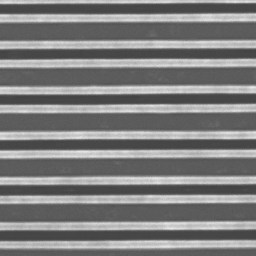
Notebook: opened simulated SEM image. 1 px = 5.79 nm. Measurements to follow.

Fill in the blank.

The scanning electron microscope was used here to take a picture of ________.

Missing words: parallel lines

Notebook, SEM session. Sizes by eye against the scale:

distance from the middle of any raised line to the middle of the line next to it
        0.131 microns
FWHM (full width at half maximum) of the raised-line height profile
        51.3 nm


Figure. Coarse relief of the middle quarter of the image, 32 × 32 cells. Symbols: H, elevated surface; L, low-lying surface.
HHHHHHHHHHHHHHHHHHHHHHHHHHHHHHHH
LLLLLLLLLLLLLLLLLLLLLLLLLLLLLLLL
LLLLLLLLLLLLLLLLLLLLLLLLLLLLLLLL
LLLLLLLLLLLLLLLLLLLLLLLLLLLLLLLL
LLLLLLLLLLLLLLLLLLLLLLLLLLLLLLLL
LLLLLLLLLLLLLLLLHHHHHHHHHHHHHHHH
HHHHHHHHHHHHHHHHHHHHHHHHHHHHHHHH
HHHHHHHHHHHHHHHHHHHHLLLLLLLLLLLL
LLLLLLLLLLLLLLLLLLLLLLLLLLLLLLLL
LLLLLLLLLLLLLLLLLLLLLLLLLLLLLLLL
HHHHHHHHHHHHHHHHHHHHHHHHHHHHHHHH
HHHHHHHHHHHHHHHHHHHHHHHHHHHHHHHH
LLLLLLLLLLLLLLLLLLLLLLLLLLLLLLLL
LLLLLLLLLLLLLLLLLLLLLLLLLLLLLLLL
LLLLLLLLLLLLLLLLLLLLLLLLLLLLLLLL
LLLLLLLLLLLLLLLLLLLLLLLLLLLLLLLL
LLLLLLLLLLLLLLLLLLLLLLLLLLLLLLLL
HHHHHHHHHHHHHHHHHHHHHHHHHHHHHHHH
HHHHHHHHHHHHHHHHHHHHHHHHHHHHHHHH
LLLLLLLLLLLLLLLLLLLLLLLLLLLLLLLL
LLLLLLLLLLLLLLLLLLLLLLLLLLLLLLLL
LLLLLLLLLLLLLLLLHHHHHHHHHHHHHHHH
HHHHHHHHHHHHHHHHHHHHHHHHHHHHHHHH
HHHHHHHHHLLLLLLLLLLLLLLLLLLLLLLL
LLLLLLLLLLLLLLLLLLLLLLLLLLLLLLLL
LLLLLLLLLLLLLLLLLLLLLLLLLLLLLLLL
LLLLLLLLLLLLLLLLLLLLLLLLLLLLLLLL
LLLLLLLLLLLLLLLLLLLLLLLLLLLLLLLL
HHHHHHHHHHHHHHHHHHHHHHHHHHHHHHHH
HHHHHHHHHHHHHHHHHHHHHHHHHHHHHHHH
LLLLLLLLLLLLLLLLLLLLLLLLLLLLLLLL
LLLLLLLLLLLLLLLLLLLLLLLLLLLLLLLL